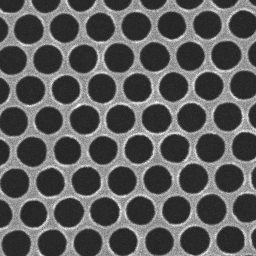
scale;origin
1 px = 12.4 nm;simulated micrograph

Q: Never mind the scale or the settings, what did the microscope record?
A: a regular array of holes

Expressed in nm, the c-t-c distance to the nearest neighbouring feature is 437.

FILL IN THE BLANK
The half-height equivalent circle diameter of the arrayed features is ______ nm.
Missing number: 368